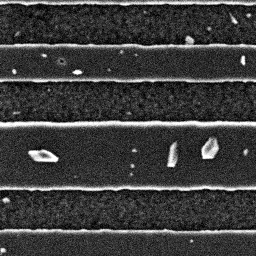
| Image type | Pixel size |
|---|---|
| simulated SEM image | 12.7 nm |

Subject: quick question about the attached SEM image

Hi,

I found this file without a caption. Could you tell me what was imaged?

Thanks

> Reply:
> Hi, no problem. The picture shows lines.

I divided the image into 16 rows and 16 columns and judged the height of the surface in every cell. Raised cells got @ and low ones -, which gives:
----------------
----------------
----------------
@@@@@@@@@@@@@@@@
@@@@@@@@@@@@@@@@
----------------
----------------
----------------
@@@@@@@@@@@@@@@@
@@@@@@@@@@@@@@@@
@@@@@@@@@@@@@@@@
@@@@@@@@@@@@@@@@
----------------
----------------
@@@@@@@@@@@@@@@@
@@@@@@@@@@@@@@@@